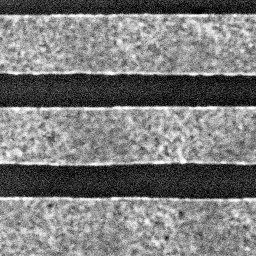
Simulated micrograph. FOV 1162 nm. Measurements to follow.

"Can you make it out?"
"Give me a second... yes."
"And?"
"lines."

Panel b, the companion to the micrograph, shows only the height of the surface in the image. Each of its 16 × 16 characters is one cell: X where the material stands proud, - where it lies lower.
----------------
XXXXXXXXXXXXXXXX
XXXXXXXXXXXXXXXX
XXXXXXXXXXXXXXXX
XXXXXXXXXXXXXXXX
----------------
----------------
XXXXXXXXXXXXXXXX
XXXXXXXXXXXXXXXX
XXXXXXXXXXXXXXXX
----------------
----------------
XXXXXXXXXXXXXXXX
XXXXXXXXXXXXXXXX
XXXXXXXXXXXXXXXX
XXXXXXXXXXXXXXXX